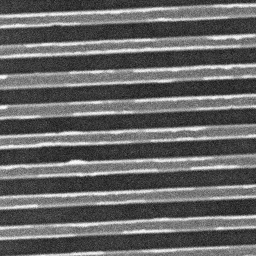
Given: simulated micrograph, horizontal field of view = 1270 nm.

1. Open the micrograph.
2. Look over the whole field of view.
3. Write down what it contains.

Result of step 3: parallel lines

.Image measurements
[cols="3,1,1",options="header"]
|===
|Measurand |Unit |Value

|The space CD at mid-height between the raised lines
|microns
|0.0824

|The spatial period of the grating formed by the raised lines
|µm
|0.15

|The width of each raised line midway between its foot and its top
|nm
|65.7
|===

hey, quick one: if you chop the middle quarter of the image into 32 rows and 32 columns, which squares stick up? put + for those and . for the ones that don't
................................
..............++++++++++++++++++
++++++++++++++++++++++++++++++++
++++++++++++++++++++++++++++++++
+++++++++++++++++++++..++.......
................................
................................
................................
.............................+++
.......+++++++++++++++++++++++++
++++++++++++++++++++++++++++++++
++++++++++++++++++++++++++++++++
+++++++++.......................
................................
................................
................................
................+..+++++++++++++
++++++++++++++++++++++++++++++++
++++++++++++++++++++++++++++++++
++++++++++++++++++..............
................................
................................
................................
..............................++
.+++++.+++++++++++++++++++++++++
++++++++++++++++++++++++++++++++
++++++++++++++++++++++++++++....
+++++++++++.....................
................................
................................
................................
.......................+++++++++